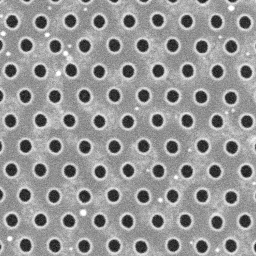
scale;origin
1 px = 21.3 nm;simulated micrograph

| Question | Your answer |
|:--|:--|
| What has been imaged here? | a regular array of holes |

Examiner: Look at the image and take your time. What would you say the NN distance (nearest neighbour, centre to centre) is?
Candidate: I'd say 593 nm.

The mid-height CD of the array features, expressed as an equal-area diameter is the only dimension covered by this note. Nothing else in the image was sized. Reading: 283 nanometers